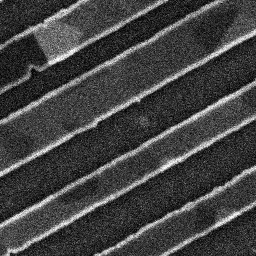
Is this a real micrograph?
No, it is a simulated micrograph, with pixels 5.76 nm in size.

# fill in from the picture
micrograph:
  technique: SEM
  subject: one or a few lines or trenches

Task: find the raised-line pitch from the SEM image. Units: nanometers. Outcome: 449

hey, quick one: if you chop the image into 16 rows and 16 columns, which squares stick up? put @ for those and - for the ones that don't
----@@@@@----@@@
---@@@@@---@@@@@
-@@@@@---@@@@@@-
@@@@----@@@@@---
@@----@@@@@-----
----@@@@@@-----@
--@@@@@@------@@
@@@@@@------@@@@
@@@@------@@@@--
@@@-----@@@@----
@-----@@@@------
-----@@@@-----@@
---@@@@-----@@@@
-@@@@------@@@@-
@@@------@@@@---
@------@@@@-----